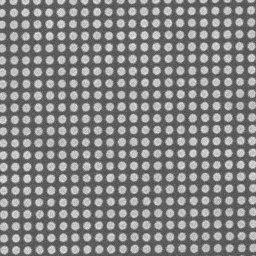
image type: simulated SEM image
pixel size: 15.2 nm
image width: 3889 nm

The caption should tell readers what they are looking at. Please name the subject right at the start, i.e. a regular array of raised bodies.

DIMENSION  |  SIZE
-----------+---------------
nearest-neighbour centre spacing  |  175 nanometres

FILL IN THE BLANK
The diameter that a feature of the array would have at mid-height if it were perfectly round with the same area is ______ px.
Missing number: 7.74